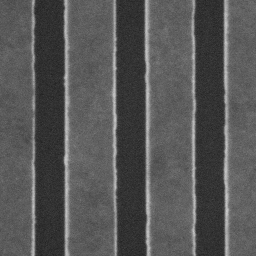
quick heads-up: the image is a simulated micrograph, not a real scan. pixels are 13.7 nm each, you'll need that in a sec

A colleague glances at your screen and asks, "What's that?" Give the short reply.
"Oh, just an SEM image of lines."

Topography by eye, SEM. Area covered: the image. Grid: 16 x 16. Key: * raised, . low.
**..***..***..**
**..***..***..**
**..***..***..**
**..***..***..**
**..***..***..**
**..***..***..**
**..***..***..**
**..***..***..**
**..***..***..**
**..***..***..**
**..***..***..**
**..***..***..**
**..***..***..**
**..***..***..**
**..***..***..**
**..***..***..**